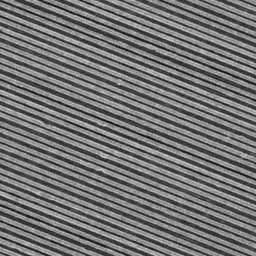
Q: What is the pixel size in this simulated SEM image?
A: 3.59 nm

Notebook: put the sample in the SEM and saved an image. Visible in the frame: parallel lines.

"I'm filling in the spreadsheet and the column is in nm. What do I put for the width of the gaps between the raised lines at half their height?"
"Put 13.8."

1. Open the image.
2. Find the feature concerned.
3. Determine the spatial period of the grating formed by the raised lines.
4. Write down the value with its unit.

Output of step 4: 26.4 nanometers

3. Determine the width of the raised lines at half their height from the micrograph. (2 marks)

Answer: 12.2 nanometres